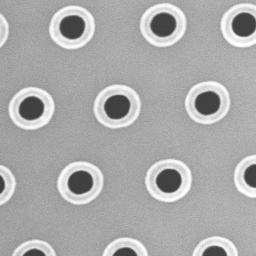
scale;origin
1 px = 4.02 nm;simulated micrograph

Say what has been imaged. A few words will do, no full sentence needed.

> ring-shaped raised bodies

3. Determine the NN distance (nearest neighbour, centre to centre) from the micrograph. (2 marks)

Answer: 0.35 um